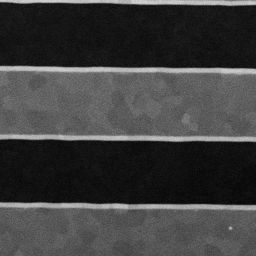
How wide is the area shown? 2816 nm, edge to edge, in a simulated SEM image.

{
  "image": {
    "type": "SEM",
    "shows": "wiring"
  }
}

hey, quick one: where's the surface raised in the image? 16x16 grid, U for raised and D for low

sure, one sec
DDDDDDDDDDDDDDDD
DDDDDDDDDDDDDDDD
DDDDDDDDDDDDDDDD
DDDDDDDDDDDDDDDD
UUUUUUUUUUUUUUUU
UUUUUUUUUUUUUUUU
UUUUUUUUUUUUUUUU
UUUUUUUUUUUUUUUU
UUUUUUUUUUUUUUUU
DDDDDDDDDDDDDDDD
DDDDDDDDDDDDDDDD
DDDDDDDDDDDDDDDD
DDDDDDDDDDDDDDDD
UUUUUUUUUUUUUUUU
UUUUUUUUUUUUUUUU
UUUUUUUUUUUUUUUU